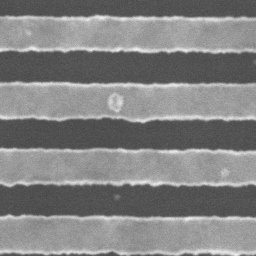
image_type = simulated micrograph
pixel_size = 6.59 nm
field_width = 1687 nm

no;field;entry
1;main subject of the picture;lines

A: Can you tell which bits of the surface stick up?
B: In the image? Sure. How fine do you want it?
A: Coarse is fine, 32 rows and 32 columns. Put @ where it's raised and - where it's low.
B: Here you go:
--------------------------------
--------------------------------
@@@@@@@@@@@@@@@@@@@@@@@@@@@@@@@@
@@@@@@@@@@@@@@@@@@@@@@@@@@@@@@@@
@@@@@@@@@@@@@@@@@@@@@@@@@@@@@@@@
@@@@@@@@@@@@@@@@@@@@@@@@@@@@@@@@
------------------@@-@----@@@@--
--------------------------------
--------------------------------
--------------------------------
@@@@@@@@@@-@@-@@@----@@---@@---@
@@@@@@@@@@@@@@@@@@@@@@@@@@@@@@@@
@@@@@@@@@@@@@@@@@@@@@@@@@@@@@@@@
@@@@@@@@@@@@@@@@@@@@@@@@@@@@@@@@
@@@@@@@@@@@@@@@@@@@@@@@@@@@@@@@@
--------------------------------
--------------------------------
--------------------------------
--------------------------------
@@@@@@@@@@@@@@@@@@@@@@@@@@@@@@@@
@@@@@@@@@@@@@@@@@@@@@@@@@@@@@@@@
@@@@@@@@@@@@@@@@@@@@@@@@@@@@@@@@
@@@@@@@@@@@@@@@@@@@@@@@@@@@@@@@@
--------------------------------
--------------------------------
--------------------------------
--------------------------------
@@@@@@@@@@@@@@@@@@@@@@@@@@@@@@@@
@@@@@@@@@@@@@@@@@@@@@@@@@@@@@@@@
@@@@@@@@@@@@@@@@@@@@@@@@@@@@@@@@
@@@@@@@@@@@@@@@@@@@@@@@@@@@@@@@@
@@@@@@@@@@@@@@@@@@@@@@@@@@@@@@@@